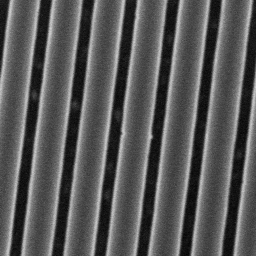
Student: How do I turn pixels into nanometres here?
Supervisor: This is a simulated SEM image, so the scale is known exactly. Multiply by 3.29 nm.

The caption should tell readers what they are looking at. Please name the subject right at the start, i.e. parallel lines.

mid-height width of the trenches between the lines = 43.6 nm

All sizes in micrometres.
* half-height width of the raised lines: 0.0967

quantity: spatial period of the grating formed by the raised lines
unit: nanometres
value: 139